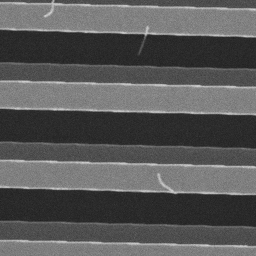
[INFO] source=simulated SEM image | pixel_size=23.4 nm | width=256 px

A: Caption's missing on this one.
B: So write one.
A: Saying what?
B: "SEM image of lines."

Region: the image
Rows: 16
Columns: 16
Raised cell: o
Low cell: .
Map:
oooooooooooooooo
oooooooooooooooo
................
................
oooooooooooooooo
oooooooooooooooo
oooooooooooooooo
................
................
oooooooooooooooo
oooooooooooooooo
oooooooooooooooo
................
................
oooooooooooooooo
oooooooooooooooo